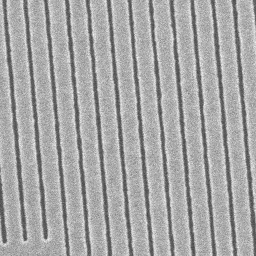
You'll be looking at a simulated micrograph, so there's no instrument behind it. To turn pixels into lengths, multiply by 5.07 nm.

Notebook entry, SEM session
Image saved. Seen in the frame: parallel lines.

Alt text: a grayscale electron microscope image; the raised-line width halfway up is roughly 80.8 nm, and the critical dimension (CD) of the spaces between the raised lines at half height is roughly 24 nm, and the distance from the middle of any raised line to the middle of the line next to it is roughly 106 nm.